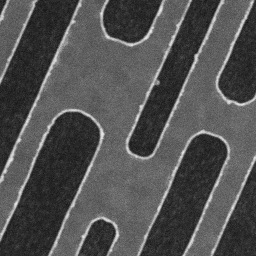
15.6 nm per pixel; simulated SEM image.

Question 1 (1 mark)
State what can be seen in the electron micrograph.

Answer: one or a few lines or trenches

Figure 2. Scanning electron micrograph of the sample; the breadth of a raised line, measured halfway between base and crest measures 415 nanometres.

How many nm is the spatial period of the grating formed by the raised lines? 1000